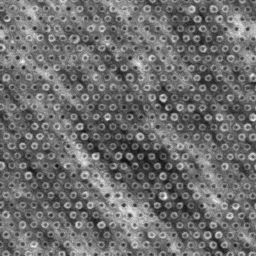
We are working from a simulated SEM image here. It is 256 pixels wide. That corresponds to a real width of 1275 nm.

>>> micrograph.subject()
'a regular array of raised bodies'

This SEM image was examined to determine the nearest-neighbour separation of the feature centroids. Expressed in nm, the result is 54.7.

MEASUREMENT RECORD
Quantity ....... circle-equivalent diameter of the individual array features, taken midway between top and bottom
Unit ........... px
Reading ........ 5.96